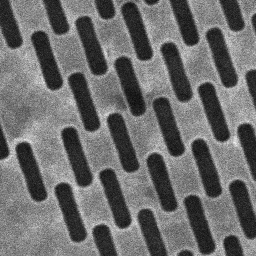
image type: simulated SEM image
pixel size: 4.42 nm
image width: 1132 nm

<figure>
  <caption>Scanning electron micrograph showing a regular array of holes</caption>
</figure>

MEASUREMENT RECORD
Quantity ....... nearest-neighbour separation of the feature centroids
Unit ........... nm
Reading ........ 211